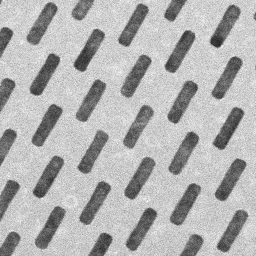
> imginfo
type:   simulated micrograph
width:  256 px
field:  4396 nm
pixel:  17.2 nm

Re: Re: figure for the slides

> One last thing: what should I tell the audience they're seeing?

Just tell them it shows a regular array of holes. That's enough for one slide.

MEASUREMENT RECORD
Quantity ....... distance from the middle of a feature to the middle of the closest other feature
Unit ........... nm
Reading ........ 869